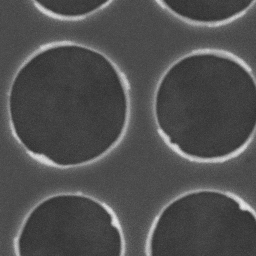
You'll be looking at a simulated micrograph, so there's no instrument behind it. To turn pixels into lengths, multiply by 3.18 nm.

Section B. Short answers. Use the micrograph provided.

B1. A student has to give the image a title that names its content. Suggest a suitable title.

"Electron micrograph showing holes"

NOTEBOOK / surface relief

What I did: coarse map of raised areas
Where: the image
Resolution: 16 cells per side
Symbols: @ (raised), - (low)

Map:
@@@---@@@@@----@
@@@@@@@@@@@@@@@@
@@@@@@@@@@@@@@@@
@@----@@@@@@--@@
@------@@@-----@
@-------@@------
@-------@@------
@-------@@------
@-------@@------
@@-----@@@@@--@@
@@@@@@@@@@@@@@@@
@@@@@@@@@@@@@@@@
@@@---@@@@@----@
@@-----@@@------
@------@@@------
@-------@-------